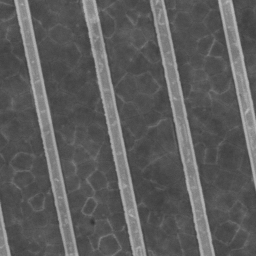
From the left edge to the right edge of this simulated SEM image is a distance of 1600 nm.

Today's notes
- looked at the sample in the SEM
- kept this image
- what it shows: one or a few lines or trenches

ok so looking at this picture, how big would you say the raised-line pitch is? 66.7 px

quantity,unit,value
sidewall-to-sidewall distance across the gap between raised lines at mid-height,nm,350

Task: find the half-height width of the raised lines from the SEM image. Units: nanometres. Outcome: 65.9